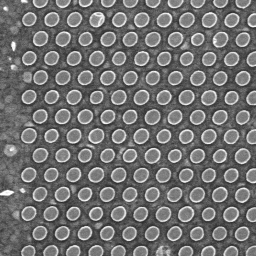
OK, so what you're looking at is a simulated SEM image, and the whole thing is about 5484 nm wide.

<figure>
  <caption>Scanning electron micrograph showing a regular array of raised bodies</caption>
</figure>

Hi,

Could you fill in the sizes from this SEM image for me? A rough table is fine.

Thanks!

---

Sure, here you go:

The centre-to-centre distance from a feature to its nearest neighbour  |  475 nm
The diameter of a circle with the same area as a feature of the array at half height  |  300 nanometers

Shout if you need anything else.